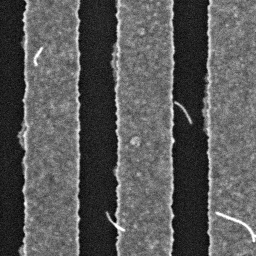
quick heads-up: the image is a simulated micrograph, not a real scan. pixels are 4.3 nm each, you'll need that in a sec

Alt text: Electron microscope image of lines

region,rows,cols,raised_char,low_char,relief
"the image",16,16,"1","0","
0011100111100111
0111100111100111
0011100111100111
0011100111100111
0011100111100111
0011100111100111
0111100111100111
0011100111100111
0011100111100111
0011100111100111
0011100111100111
0111100111100111
0011100111100111
0011100111100111
0111100111100111
0111100111100111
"